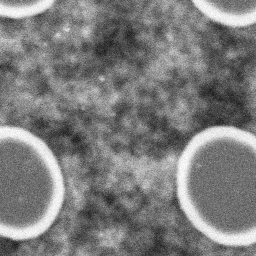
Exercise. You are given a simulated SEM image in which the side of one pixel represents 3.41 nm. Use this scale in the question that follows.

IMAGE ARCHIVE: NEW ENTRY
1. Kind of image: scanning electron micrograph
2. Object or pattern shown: raised bodies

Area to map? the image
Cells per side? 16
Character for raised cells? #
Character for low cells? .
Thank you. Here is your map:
##...........###
................
................
................
................
................
................
................
##...........##.
###.........####
###........#####
####.......#####
####.......#####
###.........####
##...........###
................